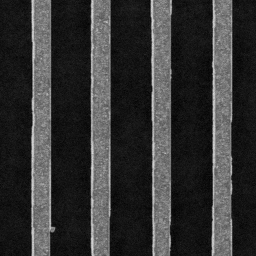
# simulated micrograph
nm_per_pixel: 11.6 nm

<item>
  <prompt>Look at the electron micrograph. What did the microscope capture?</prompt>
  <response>lines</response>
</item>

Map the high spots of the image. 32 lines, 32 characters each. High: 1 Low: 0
00001100000011000001100000011000
00001100000011000001100000011000
00001100000011000001100000011000
00001100000011000001100000011000
00001100000011000001100000011000
00001100000011000001100000011000
00001100000011000001100000011000
00001100000111000001100000011000
00001100000111000001100000011000
00001100000011000001100000011000
00001100000011000001100000011000
00001100000011000001100000011000
00001100000011000001100000011000
00001100000011000001100000011000
00001100000111000001100000011000
00001100000111000001100000011000
00001100000111000001100000011000
00001100000111000001100000011000
00001100000011000001100000011000
00001100000011000001100000011000
00001100000011000001100000011000
00001100000011000001100000011000
00001100000011000001100000011000
00001100000011000001100000011000
00001100000011000001100000011000
00001100000011000001100000011000
00001100000111000001100000011000
00001100000111000001100000011000
00001100000011000001100000011000
00001100000011000001100000011000
00001100000011000001100000011000
00001100000011000001100000011000